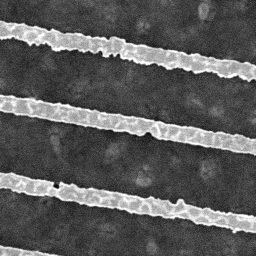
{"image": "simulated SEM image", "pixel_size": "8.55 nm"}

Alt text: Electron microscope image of one or a few lines or trenches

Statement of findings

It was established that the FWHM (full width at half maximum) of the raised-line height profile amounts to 130 nm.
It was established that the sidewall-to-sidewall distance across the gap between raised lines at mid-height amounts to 504 nm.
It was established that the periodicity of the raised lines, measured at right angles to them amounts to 639 nanometers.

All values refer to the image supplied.